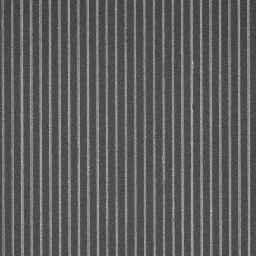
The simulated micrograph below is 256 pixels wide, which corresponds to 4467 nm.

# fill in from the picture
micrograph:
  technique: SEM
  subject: parallel lines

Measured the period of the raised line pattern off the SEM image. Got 165 nanometers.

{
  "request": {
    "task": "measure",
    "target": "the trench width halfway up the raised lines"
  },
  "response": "0.137 um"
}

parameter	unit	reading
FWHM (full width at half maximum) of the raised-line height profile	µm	0.0262